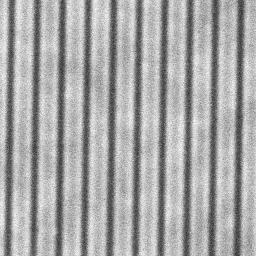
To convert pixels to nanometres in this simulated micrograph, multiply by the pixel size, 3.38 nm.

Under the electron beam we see parallel lines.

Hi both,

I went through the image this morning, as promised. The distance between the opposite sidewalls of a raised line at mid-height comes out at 57.8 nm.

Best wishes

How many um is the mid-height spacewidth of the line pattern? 0.0287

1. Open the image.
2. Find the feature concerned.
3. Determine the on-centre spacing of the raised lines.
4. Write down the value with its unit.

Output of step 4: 85.9 nanometers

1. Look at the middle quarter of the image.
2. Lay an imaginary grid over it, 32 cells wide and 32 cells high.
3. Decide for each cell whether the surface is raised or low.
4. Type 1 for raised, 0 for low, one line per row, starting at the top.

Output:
01111001111001111000111100111100
01111001111001111000111100111100
01111001111001111000111100111100
01111001111001111000111100111100
11111001111001111000111100111100
11111001111001111000111100111100
11111001111001111000111100111100
11110001111001111000111100111100
11110001111001111001111100111100
11110001111001111000111100111100
11110001111001111000111100111100
11110001111001111001111100111100
11110001111001111001111100111100
11110001111001111001111100111100
11110001111001111001111100111100
11110001111001111001111100111100
11110001111001111001111100111100
11110001111001111000111100111100
11110001111001111001111100111100
11110001111001111001111100111100
11110001111001111001111100111100
11110001111001111001111100111100
11110001111001111001111100111100
11110001111001111001111100111100
11110001111001111001111000111100
11110001111001111001111000111100
11110001111001111001111000111100
11110001111001111001111000111100
11110001111001111001111000111100
11110001111001111001111000111100
11110001111001111001111000111100
11110011111001111001111000111100